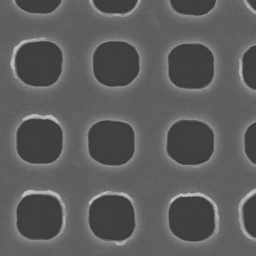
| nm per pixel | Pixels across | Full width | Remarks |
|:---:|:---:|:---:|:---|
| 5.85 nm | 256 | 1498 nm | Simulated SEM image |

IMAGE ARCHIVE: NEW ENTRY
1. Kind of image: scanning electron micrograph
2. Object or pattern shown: a regular array of holes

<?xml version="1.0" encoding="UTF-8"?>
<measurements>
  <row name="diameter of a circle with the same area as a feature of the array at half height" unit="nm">278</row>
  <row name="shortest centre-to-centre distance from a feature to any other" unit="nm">439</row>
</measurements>